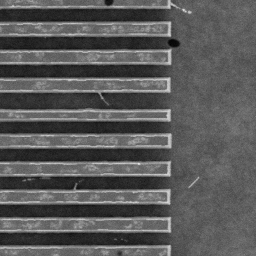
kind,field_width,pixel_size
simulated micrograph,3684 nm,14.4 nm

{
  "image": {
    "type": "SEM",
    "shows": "parallel lines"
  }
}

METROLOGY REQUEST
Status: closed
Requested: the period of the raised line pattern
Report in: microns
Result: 0.403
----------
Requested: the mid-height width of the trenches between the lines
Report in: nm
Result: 202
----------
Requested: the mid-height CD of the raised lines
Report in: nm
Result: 202